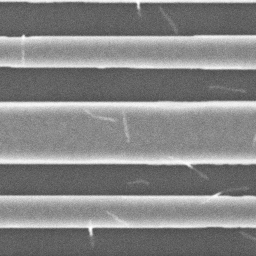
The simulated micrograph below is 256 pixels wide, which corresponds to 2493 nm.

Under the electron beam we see lines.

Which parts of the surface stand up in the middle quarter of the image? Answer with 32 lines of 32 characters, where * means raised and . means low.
********************************
................................
................................
................................
................................
................................
................................
................................
................................
................................
********************************
********************************
********************************
********************************
********************************
********************************
********************************
********************************
********************************
********************************
********************************
********************************
********************************
********************************
********************************
................................
................................
................................
................................
................................
................................
................................